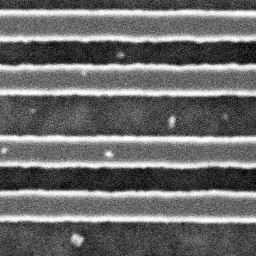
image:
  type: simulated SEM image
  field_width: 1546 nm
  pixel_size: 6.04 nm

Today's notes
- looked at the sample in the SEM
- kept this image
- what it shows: lines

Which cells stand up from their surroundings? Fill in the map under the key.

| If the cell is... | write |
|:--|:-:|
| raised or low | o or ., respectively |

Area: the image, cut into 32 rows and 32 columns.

................................
oooooooooooooooooo....oooo......
oooooooooooooooooooooooooooooooo
oooooooooooooooooooooooooooooooo
oooooooooooooooooooooooooooooooo
................................
................................
................................
oooooooooooooooooooooooooooooooo
oooooooooooooooooooooooooooooooo
oooooooooooooooooooooooooooooooo
oooooooooooooooooooooooooooooooo
................................
................................
................................
................................
................................
oooooooooooooooooooooooooooooooo
oooooooooooooooooooooooooooooooo
oooooooooooooooooooooooooooooooo
oooooooooooooooooooooooooooooooo
................................
................................
................................
oooooooooooooooooooooooooooooooo
oooooooooooooooooooooooooooooooo
oooooooooooooooooooooooooooooooo
ooo.oooo.ooooooooooooooooooooooo
................................
................................
................................
................................